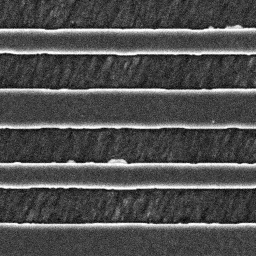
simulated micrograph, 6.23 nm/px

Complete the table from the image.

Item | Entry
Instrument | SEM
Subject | lines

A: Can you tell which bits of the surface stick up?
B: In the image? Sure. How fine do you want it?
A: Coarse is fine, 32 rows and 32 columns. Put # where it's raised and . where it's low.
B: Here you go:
................................
................................
................................
................................
################################
################################
################################
................................
................................
................................
................................
################################
################################
################################
################################
################################
................................
................................
................................
................................
################.###############
################################
################################
.............####...............
................................
................................
................................
................................
################################
################################
################################
################################